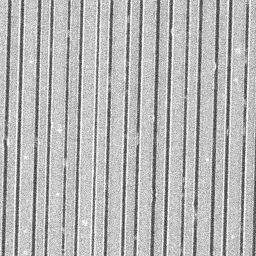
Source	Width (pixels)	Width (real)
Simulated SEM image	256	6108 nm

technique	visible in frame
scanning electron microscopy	parallel lines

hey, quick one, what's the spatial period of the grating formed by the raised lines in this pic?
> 355 nm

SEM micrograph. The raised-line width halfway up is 125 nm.